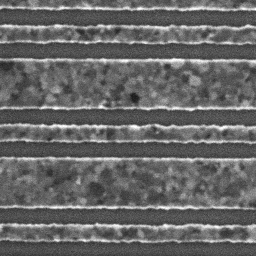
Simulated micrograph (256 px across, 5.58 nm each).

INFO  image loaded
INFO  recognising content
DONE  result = lines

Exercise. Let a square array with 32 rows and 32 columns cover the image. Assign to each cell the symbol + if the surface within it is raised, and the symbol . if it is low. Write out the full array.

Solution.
++++++++++++++++++++++++++++++++
................................
................................
++++++++++++++++++++++++++++++++
++++++++++++++++++++++++++++++++
................................
................................
................................
++++++++++++++++++++++++++++++++
++++++++++++++++++++++++++++++++
++++++++++++++++++++++++++++++++
++++++++++++++++++++++++++++++++
++++++++++++++++++++++++++++++++
+++..+++++...++..++..+++++++++++
................................
................................
++++++++++++++++++++++++++++++++
++++++++++++++++++++++++++++++++
................................
................................
++++++++++++++++++++++++++++++++
++++++++++++++++++++++++++++++++
++++++++++++++++++++++++++++++++
++++++++++++++++++++++++++++++++
++++++++++++++++++++++++++++++++
++++++++++++++++++++++++++++++++
................................
................................
++++++++++++++++++++++++++++++++
++++++++++++++++++++++++++++++++
................................
................................